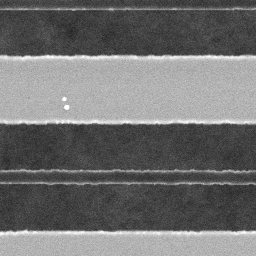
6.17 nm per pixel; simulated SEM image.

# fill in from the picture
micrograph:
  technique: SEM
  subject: lines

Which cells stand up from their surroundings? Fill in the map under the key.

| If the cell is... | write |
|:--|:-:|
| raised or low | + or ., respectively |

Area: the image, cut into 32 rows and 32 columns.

++++++++++++++++++++++++++++++++
................................
................................
................................
................................
................................
................................
++++++++++++++++++++++++++++++++
++++++++++++++++++++++++++++++++
++++++++++++++++++++++++++++++++
++++++++++++++++++++++++++++++++
++++++++++++++++++++++++++++++++
++++++++++++++++++++++++++++++++
++++++++++++++++++++++++++++++++
++++++++++++++++++++++++++++++++
................................
................................
................................
................................
................................
................................
++++++++++++++++++++++++++++++++
++++++++++++++++++++++++++++++++
................................
................................
................................
................................
................................
................................
++++++++++++++++++++++++++++++++
++++++++++++++++++++++++++++++++
++++++++++++++++++++++++++++++++